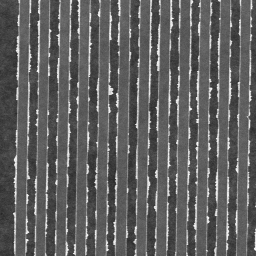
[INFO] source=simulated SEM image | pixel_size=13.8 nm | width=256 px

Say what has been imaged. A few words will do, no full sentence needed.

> parallel lines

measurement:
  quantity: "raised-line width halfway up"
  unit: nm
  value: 139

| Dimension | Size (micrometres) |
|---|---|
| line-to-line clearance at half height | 0.138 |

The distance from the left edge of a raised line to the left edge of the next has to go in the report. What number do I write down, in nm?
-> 276